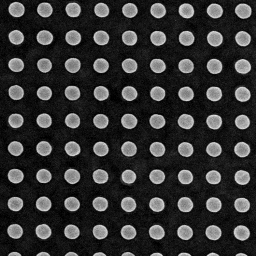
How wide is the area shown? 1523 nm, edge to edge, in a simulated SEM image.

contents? a regular array of raised bodies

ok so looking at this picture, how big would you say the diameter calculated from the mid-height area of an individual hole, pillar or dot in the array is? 0.0868 micrometres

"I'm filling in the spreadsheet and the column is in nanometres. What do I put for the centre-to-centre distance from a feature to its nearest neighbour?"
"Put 165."